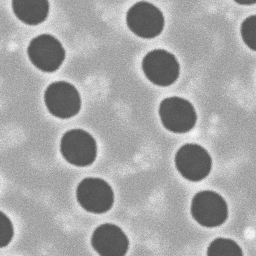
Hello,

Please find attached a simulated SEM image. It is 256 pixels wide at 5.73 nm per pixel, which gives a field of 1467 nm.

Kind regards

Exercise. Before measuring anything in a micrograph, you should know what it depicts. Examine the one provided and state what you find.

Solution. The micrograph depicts a regular array of holes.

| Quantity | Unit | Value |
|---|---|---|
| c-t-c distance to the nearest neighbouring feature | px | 49.7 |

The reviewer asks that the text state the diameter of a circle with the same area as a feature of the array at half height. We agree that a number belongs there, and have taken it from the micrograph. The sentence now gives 219 nanometers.